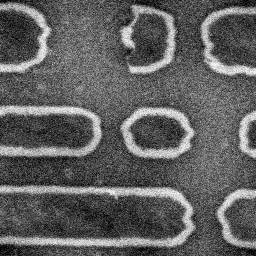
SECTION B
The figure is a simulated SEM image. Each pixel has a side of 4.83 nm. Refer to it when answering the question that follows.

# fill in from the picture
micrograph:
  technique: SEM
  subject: one or a few lines or trenches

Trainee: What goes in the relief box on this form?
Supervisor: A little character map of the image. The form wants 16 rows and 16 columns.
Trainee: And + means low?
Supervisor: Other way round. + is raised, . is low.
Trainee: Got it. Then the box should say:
+...............
+++.....+++..+++
+++.....+++..+++
+++.....+++..+++
................
................
................
++++++..+++.....
++++++..++++...+
+++++....++.....
................
................
+++++++++++...++
++++++++++++..++
++++++++++++..++
................